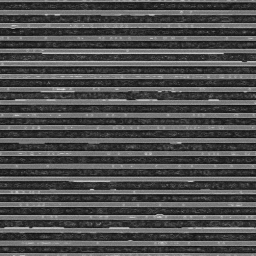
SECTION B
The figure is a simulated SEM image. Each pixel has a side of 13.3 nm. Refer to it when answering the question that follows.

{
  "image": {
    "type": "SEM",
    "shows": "parallel lines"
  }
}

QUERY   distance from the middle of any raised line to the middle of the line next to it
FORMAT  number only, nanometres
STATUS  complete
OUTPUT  171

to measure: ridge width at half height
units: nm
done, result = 63.3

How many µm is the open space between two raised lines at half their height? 0.115